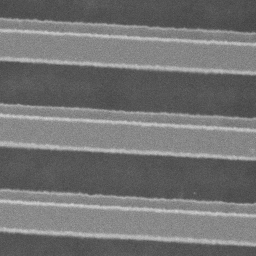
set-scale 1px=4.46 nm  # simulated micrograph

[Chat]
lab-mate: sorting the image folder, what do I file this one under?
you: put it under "lines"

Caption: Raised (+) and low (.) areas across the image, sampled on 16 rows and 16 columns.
................
+++++++.........
++++++++++++++++
++++++++++++++++
............++++
................
................
++++++++++++++++
++++++++++++++++
.......+++++++++
................
................
+++++++++++.....
++++++++++++++++
.+++++++++++++++
................